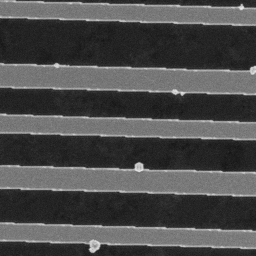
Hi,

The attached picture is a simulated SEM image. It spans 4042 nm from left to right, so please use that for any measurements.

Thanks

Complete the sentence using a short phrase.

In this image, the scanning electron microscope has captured lines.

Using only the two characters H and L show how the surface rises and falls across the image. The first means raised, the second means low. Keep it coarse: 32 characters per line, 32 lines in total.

HHHHHHHHHHHHHHLLLLLLLLLLLLLLLLLL
HHHHHHHHHHHHHHHHHHHHHHHHHHHHHHHH
LLLLLLLLLLHHHHHHHHHHHHHHHHHHHHHH
LLLLLLLLLLLLLLLLLLLLLLLLLLLLLLLL
LLLLLLLLLLLLLLLLLLLLLLLLLLLLLLLL
LLLLLLLLLLLLLLLLLLLLLLLLLLLLLLLL
LLLLLLLLLLLLLLLLLLLLLLLLLLLLLLLL
LLLLLLLLLLLLLLLLLLLLLLLLLLLLLLLL
HHHHHHHHHHHHHHHHHLLLLLLLLLLLLLLH
HHHHHHHHHHHHHHHHHHHHHHHHHHHHHHHH
HHHHHHHHHHHHHHHHHHHHHHHHHHHHHHHH
LLLLLLLLLLLLLLLLLLLLLHHHHHHHHHHH
LLLLLLLLLLLLLLLLLLLLLLLLLLLLLLLL
LLLLLLLLLLLLLLLLLLLLLLLLLLLLLLLL
HHHHHLLLLLLLLLLLLLLLLLLLLLLLLLLL
HHHHHHHHHHHHHHHHHHHHHHHHHHHHHHHH
HHHHHHHHHHHHHHHHHHHHHHHHHHHHHHHH
LLLLLLLLLLLLLLLLLLLLLLLLLLLLLLLL
LLLLLLLLLLLLLLLLLLLLLLLLLLLLLLLL
LLLLLLLLLLLLLLLLLLLLLLLLLLLLLLLL
LLLLLLLLLLLLLLLLLHLLLLLLLLLLLLLL
HHHHHHHHHHHHHHHHHHHHHHHHHHHHLLLL
HHHHHHHHHHHHHHHHHHHHHHHHHHHHHHHH
HHHHHHHHHHHHHHHHHHHHHHHHHHHHHHHH
LLLLLLLLLLLLLLLLLLLLLLLLLLLLLLLL
LLLLLLLLLLLLLLLLLLLLLLLLLLLLLLLL
LLLLLLLLLLLLLLLLLLLLLLLLLLLLLLLL
LLLLLLLLLLLLLLLLLLLLLLLLLLLLLLLL
HHHHHHHHHHHHHHHHHHHHHLLLLLLLLLLL
HHHHHHHHHHHHHHHHHHHHHHHHHHHHHHHH
LLLLLLLLLLLHHHHHHHHHHHHHHHHHHHHH
LLLLLLLLLLLLLLLLLLLLLLLLLLLLLLLL